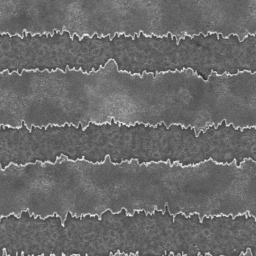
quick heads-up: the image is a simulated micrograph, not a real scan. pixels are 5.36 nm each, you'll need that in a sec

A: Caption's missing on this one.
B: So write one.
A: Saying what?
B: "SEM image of one or a few lines or trenches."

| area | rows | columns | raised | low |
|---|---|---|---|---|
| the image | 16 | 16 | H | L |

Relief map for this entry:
HHHHHHHHHHHHHHHH
HHHHHHHHHHHHHHHH
LLLLLLLLLLLLLLLL
LLLLLLLLLLLLLLLL
HHHHHHHHLLHHLLLH
HHHHHHHHHHHHHHHH
HHHHHHHHHHHHHHHH
HHHHHHHHHHHHHHHH
LLLLLLLLLLLLLLLL
LLLLLLLLLLLLLLLL
HHHHHHHHHHHHHHHH
HHHHHHHHHHHHHHHH
HHHHHHHHHHHHHHHH
HLHHHLLLLLLLHLLH
LLLLLLLLLLLLLLLL
LLLLLLLLLLLLLLLL